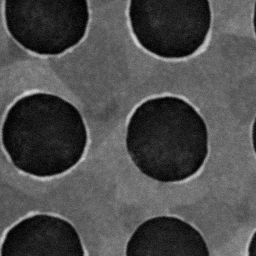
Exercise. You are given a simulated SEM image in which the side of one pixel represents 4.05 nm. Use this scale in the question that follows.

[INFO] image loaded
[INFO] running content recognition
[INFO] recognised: holes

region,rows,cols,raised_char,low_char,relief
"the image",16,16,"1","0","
0000011100000111
0000011100000111
1000011110000111
1111111111001111
1111111111111111
1111111111111111
1000111110001111
0000011100000111
0000011100000111
0000011100000111
1000111110001111
1111111111111111
1111111111111111
1100111111111111
1000011100001111
0000011100000111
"